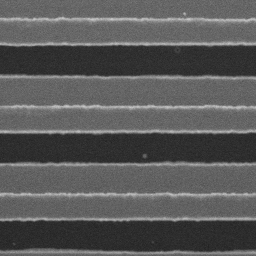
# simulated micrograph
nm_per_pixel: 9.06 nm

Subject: lines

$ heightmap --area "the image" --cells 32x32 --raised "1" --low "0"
11111111111111111111111111111111
11111111111111111111111111111111
11111111111111111111111111111111
11111111111111111111111111111111
11111111111111111111111111111111
11111111111111111111111111111111
00000000000000000000000000000000
00000000000000000000000000000000
00000000000000000000000000000000
00000000000000000000000000000000
11111111111111111111111111111111
11111111111111111111111111111111
11111111111111111111111111111111
11111111111111111111111111111111
11111111111111111111111111111111
11111111111111111111111111111111
11111111111111111110111111111110
00000000000000000000000000000000
00000000000000000000000000000000
00000000000000000000000000000000
00000000000000000000111100000000
11111111111111111111111111111111
11111111111111111111111111111111
11111111111111111111111111111111
11111111111111111111111111111111
11111111111111111111111111111111
11111111111111111111111111111111
11111111000111111010011010100110
00000000000000000000000000000000
00000000000000000000000000000000
00000000000000000000000000000000
00111111111000000000000000000000